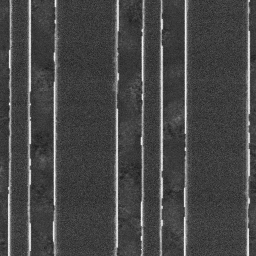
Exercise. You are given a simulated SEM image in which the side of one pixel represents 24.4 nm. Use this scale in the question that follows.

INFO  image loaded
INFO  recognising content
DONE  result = lines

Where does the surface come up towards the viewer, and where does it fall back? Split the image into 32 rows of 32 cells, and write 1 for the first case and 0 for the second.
01110001111111100011000111111110
01110001111111100011000111111110
01110001111111100011000111111110
01110001111111100011000111111110
01110001111111100011000111111110
01110001111111100011000111111110
01110001111111100011000111111110
01110001111111100011000111111110
01110001111111100011000111111110
01110001111111100011000111111110
01110001111111100011000111111110
01110001111111100011000111111110
01110001111111100011000111111110
01110001111111100011000111111110
01110001111111100011000111111110
01110001111111100011000111111110
01110001111111100011000111111110
01110001111111100011000111111110
01110001111111100011000111111110
01110001111111100011000111111110
01110001111111100011000111111110
01110001111111100011000111111110
01110001111111100011000111111110
01110001111111100011000111111110
01110001111111100011000111111110
01110001111111100011000111111110
01110001111111100011000111111110
01110001111111100011000111111110
01110001111111100011000111111110
01110001111111100011000111111110
01110001111111100011000111111110
01110001111111100011000111111110